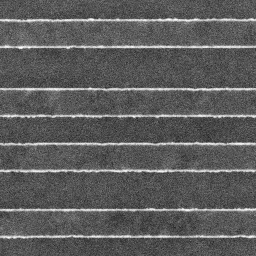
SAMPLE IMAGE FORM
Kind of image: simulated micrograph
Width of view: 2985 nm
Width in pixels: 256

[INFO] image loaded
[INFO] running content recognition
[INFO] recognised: lines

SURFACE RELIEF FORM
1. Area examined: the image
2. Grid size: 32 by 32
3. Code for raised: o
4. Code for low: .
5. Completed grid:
................................
................................
o..........oo.o..o.oooo.oooooooo
oooooooooooooooooooooooooooooooo
oooooooooooooooooooooooooooooooo
oooooooooooooooooooooooooooooooo
................................
................................
................................
................................
................................
oooooooooooooooooooooooooooooooo
oooooooooooooooooooooooooooooooo
oooooooooooooooooooooooooooooooo
ooooo.o..o.oo.oooo.o...o..oo..oo
................................
................................
................................
oooooooooooooooooooooooooooooooo
oooooooooooooooooooooooooooooooo
oooooooooooooooooooooooooooooooo
................................
................................
................................
................................
................................
oooooooooooooooooooooooooooooooo
oooooooooooooooooooooooooooooooo
oooooooooooooooooooooooooooooooo
oooooooooooooooooooooooooooooooo
................................
................................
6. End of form